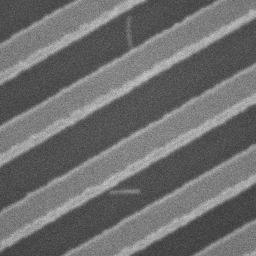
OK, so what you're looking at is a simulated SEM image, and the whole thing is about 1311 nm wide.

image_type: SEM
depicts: lines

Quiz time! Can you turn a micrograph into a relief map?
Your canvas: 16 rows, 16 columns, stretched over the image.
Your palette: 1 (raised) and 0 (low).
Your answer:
0000111100000111
0011110000011110
1111100001111000
1110000011110000
1000001111000001
0000111100000111
0001111000001111
0111100000111100
1110000011110000
1000000111100001
0000011110000111
0001111000001111
0111100000111100
1111000011110000
1100000111100001
0000011110000111